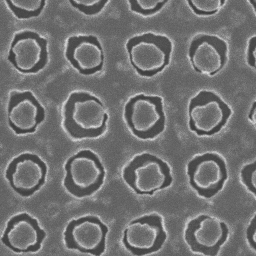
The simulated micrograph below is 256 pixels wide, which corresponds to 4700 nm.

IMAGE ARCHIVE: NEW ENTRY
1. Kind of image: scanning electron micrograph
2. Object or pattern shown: ring-shaped grooves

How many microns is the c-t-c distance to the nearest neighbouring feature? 1.06